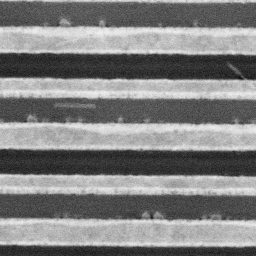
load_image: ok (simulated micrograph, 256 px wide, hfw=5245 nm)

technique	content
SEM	lines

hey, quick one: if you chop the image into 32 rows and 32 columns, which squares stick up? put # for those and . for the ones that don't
................................
................................
................................
................................
################################
################################
################################
................................
................................
................................
################################
################################
................................
................................
................................
................................
################################
################################
################################
................................
................................
................................
################################
################################
................................
................................
................................
................................
################################
################################
################################
................................